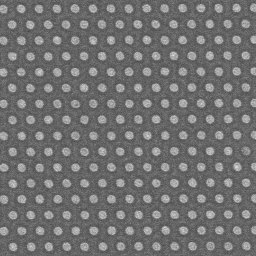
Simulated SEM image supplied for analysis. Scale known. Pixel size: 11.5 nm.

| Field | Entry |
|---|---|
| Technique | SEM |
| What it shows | a regular array of raised bodies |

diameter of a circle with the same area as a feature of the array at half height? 8.52 px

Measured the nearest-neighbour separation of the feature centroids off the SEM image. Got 17.8 px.